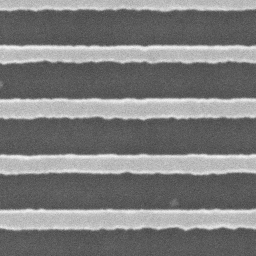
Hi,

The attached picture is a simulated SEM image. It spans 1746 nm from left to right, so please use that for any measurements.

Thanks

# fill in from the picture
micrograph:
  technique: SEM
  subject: lines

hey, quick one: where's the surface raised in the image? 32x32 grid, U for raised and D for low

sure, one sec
UUUUUUUUUUUUUUUUUUUUUUUUUUUUUUUU
DDDDDDDDDDDDDDDDDDDDDDDDDDDDDDDD
DDDDDDDDDDDDDDDDDDDDDDDDDDDDDDDD
DDDDDDDDDDDDDDDDDDDDDDDDDDDDDDDD
DDDDDDDDDDDDDDDDDDDDDDDDDDDDDDDD
DDDDDDDDDDDDDDDDDDDDDDDDDDDDDDDD
UUUUUUUUUUUUUUUUUUUUUUUUUUUUUUUU
UUUUUUUUUUUUUUUUUUUUUUUUUUUUUUUU
DDDDDDDDDDDDDDDDDDDDDDDDDDDDDDDD
DDDDDDDDDDDDDDDDDDDDDDDDDDDDDDDD
DDDDDDDDDDDDDDDDDDDDDDDDDDDDDDDD
DDDDDDDDDDDDDDDDDDDDDDDDDDDDDDDD
DDDDDDDUDDDUDDDUUDUUUDUUUDUUDUUU
UUUUUUUUUUUUUUUUUUUUUUUUUUUUUUUU
UUUUUUUUUUUUUUUUUUUUUUUUUUUUUUUU
DDDDDDDDDDDDDDDDDDDDDDDDDDDDDDDD
DDDDDDDDDDDDDDDDDDDDDDDDDDDDDDDD
DDDDDDDDDDDDDDDDDDDDDDDDDDDDDDDD
DDDDDDDDDDDDDDDDDDDDDDDDDDDDDDDD
DDDDDDDDDUDDDUUDDUDDDDDUUUDDDDDD
UUUUUUUUUUUUUUUUUUUUUUUUUUUUUUUU
UUUUUUUUUUUUUUUUUUUUUUUUUUUUUUUU
DDDDDDDDDDDDDDDDDDDDDDDDDDDDDDDD
DDDDDDDDDDDDDDDDDDDDDDDDDDDDDDDD
DDDDDDDDDDDDDDDDDDDDDDDDDDDDDDDD
DDDDDDDDDDDDDDDDDDDDDDDDDDDDDDDD
UUUUUUUUUUUUUUUUUUUUUUUUUUUUUUUU
UUUUUUUUUUUUUUUUUUUUUUUUUUUUUUUU
DUUUUUUUUUUUUUDUUDDUDDDUDDUDDDDD
DDDDDDDDDDDDDDDDDDDDDDDDDDDDDDDD
DDDDDDDDDDDDDDDDDDDDDDDDDDDDDDDD
DDDDDDDDDDDDDDDDDDDDDDDDDDDDDDDD